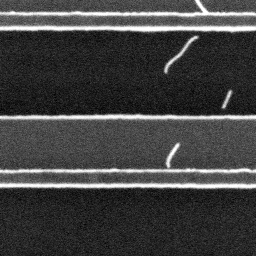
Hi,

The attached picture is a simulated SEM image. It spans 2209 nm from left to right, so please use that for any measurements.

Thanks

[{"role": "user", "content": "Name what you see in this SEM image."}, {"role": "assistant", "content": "lines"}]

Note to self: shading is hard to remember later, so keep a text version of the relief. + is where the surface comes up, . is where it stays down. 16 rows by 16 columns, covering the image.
++++++++++++++++
++++++++++++++++
................
................
................
................
................
++++++++++++++++
++++++++++++++++
++++++++++++++++
++++++++++++++++
++++++++++++++++
................
................
................
................